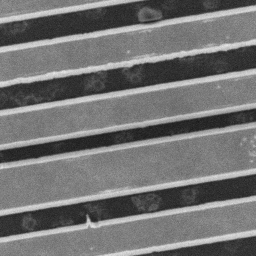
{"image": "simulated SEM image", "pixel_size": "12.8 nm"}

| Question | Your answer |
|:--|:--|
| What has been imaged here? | one or a few lines or trenches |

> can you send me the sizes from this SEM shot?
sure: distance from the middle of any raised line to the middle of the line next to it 792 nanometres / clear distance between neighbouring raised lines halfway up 342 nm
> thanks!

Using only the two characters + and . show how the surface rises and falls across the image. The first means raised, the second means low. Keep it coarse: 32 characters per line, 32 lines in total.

++++++++++++....................
++++++.......................+++
.......................+++++++++
.................+++++++++++++++
...........+++++++++++++++++++++
.....++++++++++++++++++++++++++.
++++++++++++++++++++++++........
++++++++++++++++++..............
++++++++++++....................
++++++......................++++
+.....................++++++++++
................++++++++++++++++
..........++++++++++++++++++++++
....++++++++++++++++++++++++++..
++++++++++++++++++++++++........
++++++++++++++++++..............
++++++++++++...............+++++
++++++...............+++++++++++
...............+++++++++++++++++
........++++++++++++++++++++++++
..++++++++++++++++++++++++++++++
+++++++++++++++++++++++++++++++.
+++++++++++++++++++++++++.......
+++++++++++++++++++.............
+++++++++++++...................
+++++++.....................++++
+.....................++++++++++
................++++++++++++++++
.........+++++++++++++++++++++++
...+++++++++++++++++++++++++++..
++++++++++++++++++++++++........
+++++++++++++++++...............